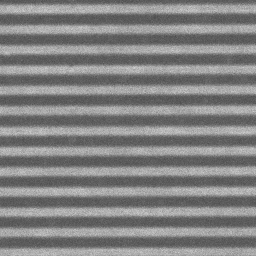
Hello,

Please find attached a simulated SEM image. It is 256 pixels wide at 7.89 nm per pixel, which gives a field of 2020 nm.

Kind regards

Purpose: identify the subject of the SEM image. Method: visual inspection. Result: parallel lines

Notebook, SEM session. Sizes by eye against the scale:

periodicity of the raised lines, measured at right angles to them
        160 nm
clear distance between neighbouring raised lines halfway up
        10.5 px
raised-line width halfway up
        75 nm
